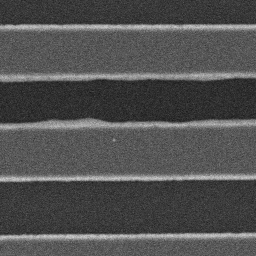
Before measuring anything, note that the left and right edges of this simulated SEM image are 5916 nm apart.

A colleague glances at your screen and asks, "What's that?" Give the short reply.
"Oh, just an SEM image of lines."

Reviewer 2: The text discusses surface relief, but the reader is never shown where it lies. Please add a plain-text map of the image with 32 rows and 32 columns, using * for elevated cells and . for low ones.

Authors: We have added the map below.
................................
................................
................................
********************************
********************************
********************************
********************************
********************************
********************************
****************************....
................................
................................
................................
................................
................................
..........***.....**...*********
********************************
********************************
********************************
********************************
********************************
********************************
******.**.......................
................................
................................
................................
................................
................................
................................
..******************************
********************************
********************************